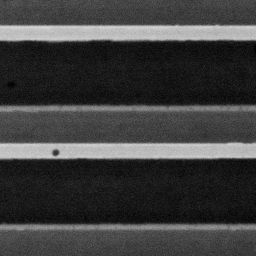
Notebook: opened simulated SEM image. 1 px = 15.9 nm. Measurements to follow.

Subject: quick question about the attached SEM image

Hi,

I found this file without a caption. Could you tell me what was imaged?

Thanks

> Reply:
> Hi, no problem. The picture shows lines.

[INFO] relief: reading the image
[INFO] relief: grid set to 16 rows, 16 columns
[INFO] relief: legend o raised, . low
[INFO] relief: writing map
oooooooooooooooo
oooooooooooooooo
................
................
................
................
................
oooooooooooooooo
oooooooooooooooo
oooooooooooooooo
................
................
................
................
oooooooooooooooo
oooooooooooooooo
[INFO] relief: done